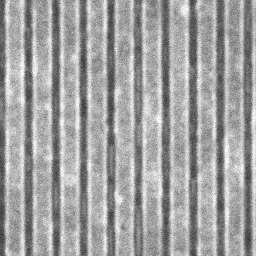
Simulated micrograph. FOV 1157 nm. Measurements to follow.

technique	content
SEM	parallel lines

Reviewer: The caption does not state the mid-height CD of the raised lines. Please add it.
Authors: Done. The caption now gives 82.4 nm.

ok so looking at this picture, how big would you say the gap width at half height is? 43.5 nm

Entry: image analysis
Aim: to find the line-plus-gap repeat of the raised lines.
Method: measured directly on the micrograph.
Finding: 124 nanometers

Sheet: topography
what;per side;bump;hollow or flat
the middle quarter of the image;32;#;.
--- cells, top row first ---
####..####...####...####...####.
####..####...####...####...####.
####..####...####...####...####.
####..####...####...####...####.
####..#####..####...####...####.
####..#####..####...####...####.
####..####...####...####...####.
####..####...####...####...####.
####..####...####...####...####.
####..####...####...####...####.
####..####...####...####...####.
####..####...####...####...####.
####..####...####...####...####.
####..####...####...####...####.
####..####...####...####...####.
####..#####..####...####...####.
####..#####..####...####...####.
####..####...####...####...####.
####..####...####...####...####.
####..####...####...####...####.
####..####...####...####...####.
####..####...####...####...####.
####..####...####...####...####.
####..####...####...####...####.
####..####...####...####...####.
####..####...####...####...####.
####..####...####...####...####.
####..####...####...####...####.
####..####...####...####...####.
####..####...####...####...####.
####..#####..####...####...####.
####..#####..####...####...####.